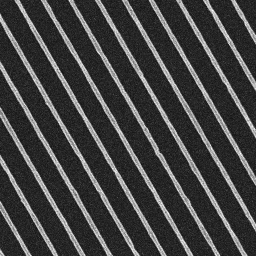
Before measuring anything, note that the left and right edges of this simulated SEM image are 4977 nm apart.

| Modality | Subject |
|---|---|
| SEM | parallel lines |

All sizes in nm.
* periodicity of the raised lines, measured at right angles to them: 454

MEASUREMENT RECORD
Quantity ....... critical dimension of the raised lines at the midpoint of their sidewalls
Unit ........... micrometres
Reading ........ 0.0695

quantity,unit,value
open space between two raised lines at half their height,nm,381